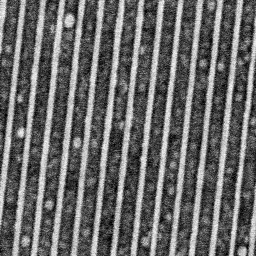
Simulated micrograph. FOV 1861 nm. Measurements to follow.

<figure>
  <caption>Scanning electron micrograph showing parallel lines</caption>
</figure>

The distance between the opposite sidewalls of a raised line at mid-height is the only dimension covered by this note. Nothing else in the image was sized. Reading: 34.3 nm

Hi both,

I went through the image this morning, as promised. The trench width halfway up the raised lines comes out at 0.109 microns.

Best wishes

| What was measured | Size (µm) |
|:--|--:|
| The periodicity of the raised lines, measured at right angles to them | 0.142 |